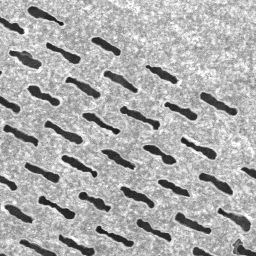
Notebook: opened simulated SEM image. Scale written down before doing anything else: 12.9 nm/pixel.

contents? a regular array of holes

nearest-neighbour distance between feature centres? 37.7 px